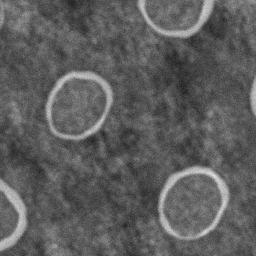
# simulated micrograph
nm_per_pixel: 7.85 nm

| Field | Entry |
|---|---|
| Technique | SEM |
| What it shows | raised bodies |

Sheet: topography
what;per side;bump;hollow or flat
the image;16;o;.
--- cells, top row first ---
.........oooo...
.........oooo...
................
................
................
...oooo.........
...oooo.........
...ooo..........
....o...........
................
................
...........ooo..
o.........oooo..
o.........oooo..
o..........oo...
................